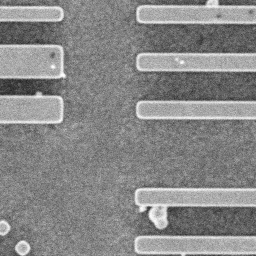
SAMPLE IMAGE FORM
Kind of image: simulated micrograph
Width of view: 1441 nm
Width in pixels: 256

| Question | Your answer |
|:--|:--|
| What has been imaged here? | groups of lines, slits or small figures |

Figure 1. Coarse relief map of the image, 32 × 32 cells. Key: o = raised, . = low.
................................
oooooooo.........ooooooooooooooo
ooooooo..........ooooooooooooooo
................................
................................
................................
oooooooo........................
oooooooo.........ooooooooooooooo
oooooooo.........ooooooooooooooo
oooooooo........................
................................
................................
oooooooo........................
oooooooo.........ooooooooooooooo
oooooooo.........ooooooooooooooo
................................
................................
................................
................................
................................
................................
................................
................................
................................
.................ooooooooooooooo
.................ooooooooooooooo
................................
................................
o...............................
................................
..o..............ooooooooooooooo
..o..............ooooooooooooooo